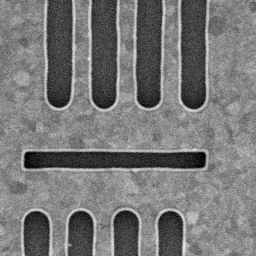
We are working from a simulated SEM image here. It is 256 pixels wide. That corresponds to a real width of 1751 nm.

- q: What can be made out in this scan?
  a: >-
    groups of lines, slits or small figures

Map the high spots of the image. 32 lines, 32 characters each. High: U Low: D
UUUUUUDDDUUDDDDUUDDDUUDDDDUUUUUU
UUUUUUDDDUUDDDDUUDDDDUDDDDUUUUUU
UUUUUUDDDUUDDDDUUDDDUUDDDDUUUUUU
UUUUUUDDDUUDDDDUUDDDUUDDDDUUUUUU
UUUUUUDDDUUDDDDUUDDDUUDDDDUUUUUU
UUUUUUDDDUUDDDDUUDDDUUDDDDUUUUUU
UUUUUUDDDUUDDDDUUDDDUUDDDDUUUUUU
UUUUUUDDDUUDDDDUUDDDUUDDDDUUUUUU
UUUUUUDDDUUDDDDUUDDDUUDDDDUUUUUU
UUUUUUDDDUUDDDDUUDDDUUDDDDUUUUUU
UUUUUUDDDUUDDDDUUDDDUUDDDDUUUUUU
UUUUUUDDDUUDDDDUUDDDUUDDDDUUUUUU
UUUUUUDDDUUDDDDUUDDDUUUDDDUUUUUU
UUUUUUUDUUUUDDUUUUDUUUUDDUUUUUUU
UUUUUUUUUUUUUUUUUUUUUUUUUUUUUUUU
UUUUUUUUUUUUUUUUUUUUUUUUUUUUUUUU
UUUUUUUUUUUUUUUUUUUUUUUUUUUUUUUU
UUUUUUUUUUUUUUUUUUUUUUUUUUUUUUUU
UUUUUUUUUUUUUUUUUUUUUUUUUUUUUUUU
UUUDDDDDDDDDDDDDDDDDDDDDDDUUUUUU
UUUDDDDDDDDDDDDDDDDDDDDDDDUUUUUU
UUUUUUUUUUUUUUUUUUUUUUUUUUUUUUUU
UUUUUUUUUUUUUUUUUUUUUUUUUUUUUUUU
UUUUUUUUUUUUUUUUUUUUUUUUUUUUUUUU
UUUUUUUUUUUUUUUUUUUUUUUUUUUUUUUU
UUUUUUUUUUUUUUUUUUUUUUUUUUUUUUUU
UUUUDUUUUDDUUUUDDUUUDDUUUUUUUUUU
UUUDDDUUDDDDUUDDDUUUDDDUUUUUUUUU
UUUDDDUUDDDDUUDDDDUUDDDUUUUUUUUU
UUUDDDUUDDDDUUDDDUUUDDDUUUUUUUUU
UUUDDDUUDDDDUUDDDUUUDDDUUUUUUUUU
UUUDDDUUDDDDUUDDDUUUDDDUUUUUUUUU